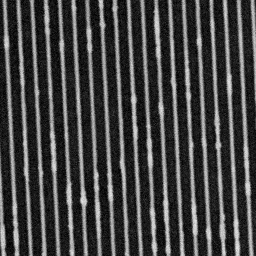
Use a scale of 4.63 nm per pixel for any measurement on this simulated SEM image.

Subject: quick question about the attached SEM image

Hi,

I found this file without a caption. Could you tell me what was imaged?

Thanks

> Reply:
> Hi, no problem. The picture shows parallel lines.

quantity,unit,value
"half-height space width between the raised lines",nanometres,48.5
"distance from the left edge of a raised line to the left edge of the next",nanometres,63.7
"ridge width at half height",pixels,3.87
